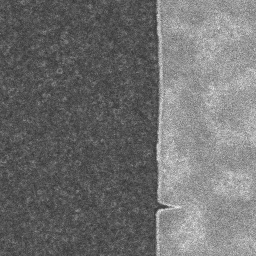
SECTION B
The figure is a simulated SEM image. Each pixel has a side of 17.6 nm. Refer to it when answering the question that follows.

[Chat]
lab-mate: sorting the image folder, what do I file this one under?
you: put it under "one or a few lines or trenches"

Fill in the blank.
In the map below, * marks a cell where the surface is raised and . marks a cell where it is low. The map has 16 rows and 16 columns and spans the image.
**********......
**********......
**********......
**********......
**********......
**********......
**********......
**********......
**********......
**********......
**********......
**********......
**********......
**********......
**********......
**********......